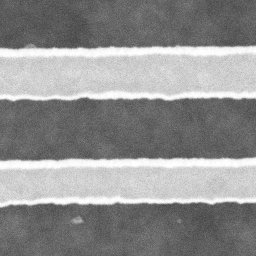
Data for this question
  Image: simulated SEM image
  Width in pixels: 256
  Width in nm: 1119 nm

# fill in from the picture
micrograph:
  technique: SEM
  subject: lines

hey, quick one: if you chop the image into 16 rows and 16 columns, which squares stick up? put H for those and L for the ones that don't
LLLLLLLLLLLLLLLL
LLLLLLLLLLLLLLLL
LLLLLLLLLLLLLLLL
HHHHHHHHHHHHHHHH
HHHHHHHHHHHHHHHH
HHHHHHHHHHHHHHHH
LLLLLLLLLLLLLLLL
LLLLLLLLLLLLLLLL
LLLLLLLLLLLLLLLL
LLLLLLLLLLLLLLLL
HHHHHHHHHHHHHHHH
HHHHHHHHHHHHHHHH
HHHHHHHHHHHHHHHH
LLLLLLLLLLLLLLLL
LLLLLLLLLLLLLLLL
LLLLLLLLLLLLLLLL